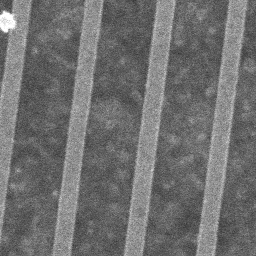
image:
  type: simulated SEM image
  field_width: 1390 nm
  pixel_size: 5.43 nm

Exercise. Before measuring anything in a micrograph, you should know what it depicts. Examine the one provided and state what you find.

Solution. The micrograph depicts one or a few lines or trenches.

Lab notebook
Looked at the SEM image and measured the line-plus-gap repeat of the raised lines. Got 387 nanometres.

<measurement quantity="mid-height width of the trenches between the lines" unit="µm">0.298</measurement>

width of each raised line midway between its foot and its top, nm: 90.2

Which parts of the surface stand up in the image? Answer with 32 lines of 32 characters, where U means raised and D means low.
DDUUDDDDDDDUUDDDDDDDUUDDDDDDDUUD
DDUUDDDDDDDUUDDDDDDDUUDDDDDDDUUD
UUUDDDDDDDUUUDDDDDDUUUDDDDDDUUUD
UUUDDDDDDDUUDDDDDDDUUDDDDDDDUUDD
DUUDDDDDDDUUDDDDDDDUUDDDDDDDUUDD
DUUDDDDDDDUUDDDDDDDUUDDDDDDDUUDD
DUUDDDDDDDUUDDDDDDDUUDDDDDDDUUDD
DUUDDDDDDDUUDDDDDDDUUDDDDDDDUUDD
DUUDDDDDDDUUDDDDDDDUUDDDDDDDUUDD
UUUDDDDDDDUUDDDDDDDUUDDDDDDDUUDD
UUDDDDDDDUUDDDDDDDUUDDDDDDDUUUDD
UUDDDDDDDUUDDDDDDDUUDDDDDDDUUDDD
UUDDDDDDDUUDDDDDDDUUDDDDDDDUUDDD
UUDDDDDDDUUDDDDDDDUUDDDDDDDUUDDD
UUDDDDDDDUUDDDDDDDUUDDDDDDDUUDDD
UUDDDDDDDUUDDDDDDDUUDDDDDDDUUDDD
UUDDDDDDDUUDDDDDDDUUDDDDDDDUUDDD
UUDDDDDDUUDDDDDDDUUUDDDDDDDUUDDD
UDDDDDDDUUDDDDDDDUUDDDDDDDUUDDDD
UDDDDDDDUUDDDDDDDUUDDDDDDDUUDDDD
UDDDDDDDUUDDDDDDDUUDDDDDDDUUDDDD
UDDDDDDDUUDDDDDDDUUDDDDDDDUUDDDD
UDDDDDDDUUDDDDDDDUUDDDDDDDUUDDDD
UDDDDDDDUUDDDDDDDUUDDDDDDDUUDDDD
UDDDDDDUUUDDDDDDDUUDDDDDDDUUDDDD
DDDDDDDUUUDDDDDDUUUDDDDDDUUDDDDD
DDDDDDDUUDDDDDDDUUDDDDDDDUUDDDDD
DDDDDDDUUDDDDDDDUUDDDDDDDUUDDDDD
DDDDDDDUUDDDDDDDUUDDDDDDDUUDDDDD
DDDDDDDUUDDDDDDDUUDDDDDDDUUDDDDD
DDDDDDDUUDDDDDDDUUDDDDDDDUUDDDDD
DDDDDDDUUDDDDDDDUUDDDDDDDUUDDDDD